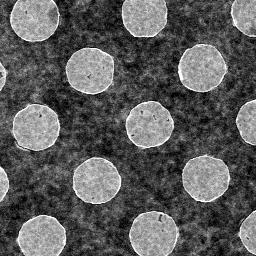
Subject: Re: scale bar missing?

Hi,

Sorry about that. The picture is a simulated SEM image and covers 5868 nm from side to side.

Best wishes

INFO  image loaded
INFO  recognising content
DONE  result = raised bodies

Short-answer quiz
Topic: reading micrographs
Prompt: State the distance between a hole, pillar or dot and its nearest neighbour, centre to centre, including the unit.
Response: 1.77 um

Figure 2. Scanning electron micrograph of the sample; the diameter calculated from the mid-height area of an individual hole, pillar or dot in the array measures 1050 nanometers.